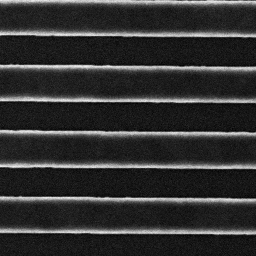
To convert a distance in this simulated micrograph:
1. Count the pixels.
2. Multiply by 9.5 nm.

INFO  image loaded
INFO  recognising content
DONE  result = lines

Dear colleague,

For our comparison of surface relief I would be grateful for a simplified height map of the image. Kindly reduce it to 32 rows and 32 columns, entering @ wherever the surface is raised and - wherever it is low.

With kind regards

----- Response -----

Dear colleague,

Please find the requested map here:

@@@@@@@@@@@@@@@@@@@@@@@@@@@@@@@@
@@@@@@@@@@@@@@@@@@@@@@@@@@@@@@@@
@@@@@@@@@@@@@@@@@@@@@@@@@@@@@@@@
@@@@@@@@@@@@@@@@@@@@@@@@@@@@@@@@
------------------------------@@
--------------------------------
--------------------------------
--------------------------------
@@@@@@@@@@@@@@@@@@@@@@@@@-------
@@@@@@@@@@@@@@@@@@@@@@@@@@@@@@@@
@@@@@@@@@@@@@@@@@@@@@@@@@@@@@@@@
@@@@@@@@@@@@@@@@@@@@@@@@@@@@@@@@
-----@@@@@@@@@@@@@@@@@@@@@@@@@@@
--------------------------------
--------------------------------
--------------------------------
@@@@@---------------------------
@@@@@@@@@@@@@@@@@@@@@@@@@@@@@@@@
@@@@@@@@@@@@@@@@@@@@@@@@@@@@@@@@
@@@@@@@@@@@@@@@@@@@@@@@@@@@@@@@@
@@@@@@@@@@@@@@@@@@@@@@@@@@@@@@@@
--------------------------------
--------------------------------
--------------------------------
--------------------------------
@@@@@@@@@@@@@@@@@@@@@@@@@@@@@@@@
@@@@@@@@@@@@@@@@@@@@@@@@@@@@@@@@
@@@@@@@@@@@@@@@@@@@@@@@@@@@@@@@@
@@@@@@@@@@@@@@@@@@@@@@@@@@@@@@@@
--------------------------------
--------------------------------
--------------------------------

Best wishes